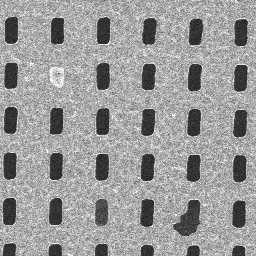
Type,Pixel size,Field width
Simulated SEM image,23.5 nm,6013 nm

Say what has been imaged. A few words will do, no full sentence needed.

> a regular array of holes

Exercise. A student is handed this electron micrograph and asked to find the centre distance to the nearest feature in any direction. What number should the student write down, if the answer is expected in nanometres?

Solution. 1060